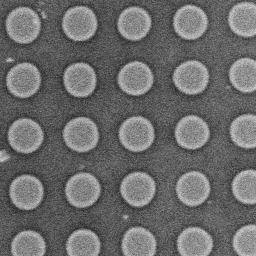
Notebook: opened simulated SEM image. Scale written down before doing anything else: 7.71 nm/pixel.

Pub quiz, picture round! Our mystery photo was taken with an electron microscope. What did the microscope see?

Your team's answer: an array of small figures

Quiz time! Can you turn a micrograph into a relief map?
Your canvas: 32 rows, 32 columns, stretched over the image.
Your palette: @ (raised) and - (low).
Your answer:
------------------------------@@
-@@@----@@@@---@@@----@@@----@@@
-@@@@---@@@@---@@@@---@@@@---@@@
-@@@@---@@@@---@@@@---@@@@---@@@
-@@@@----@@----@@@-----@@-----@-
--------------------------------
--------------------------------
------------------------------@@
--@@-----@@----@@@@---@@@@---@@@
-@@@@---@@@@---@@@@---@@@@---@@@
-@@@@---@@@@---@@@@---@@@@---@@@
-@@@-----@@-----@@-----@@-------
--------------------------------
--------------------------------
------------------------------@@
--@@@---@@@@---@@@@---@@@@---@@@
-@@@@---@@@@---@@@@---@@@@---@@@
-@@@@---@@@@---@@@@---@@@@---@@@
--@@@----@@@----@@-----@@-------
@-------------------------------
--------------------------------
------------------------------@@
--@@@----@@@---@@@@---@@@@---@@@
-@@@@---@@@@---@@@@---@@@@---@@@
-@@@@---@@@@---@@@@---@@@@---@@@
--@@@----@@-----@@-----@@-------
--------------------------------
--------------------------------
-----------------@------@-----@@
--@@@----@@@----@@@---@@@@---@@@
-@@@@@--@@@@---@@@@---@@@@---@@@
--@@@@--@@@@---@@@@---@@@@----@@